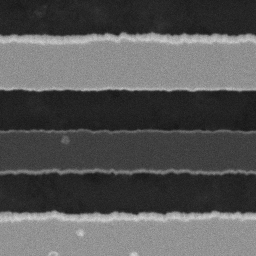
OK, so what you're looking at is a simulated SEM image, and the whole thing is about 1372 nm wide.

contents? lines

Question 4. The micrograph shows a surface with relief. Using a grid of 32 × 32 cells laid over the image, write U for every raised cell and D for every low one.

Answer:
DDDDDDDDDDDDDDDDDDDDDDDDDDDDDDDD
DDDDDDDDDDDDDDDDDDDDDDDDDDDDDDDD
DDDDDDDDDDDDDDDDDDDDDDDDDDDDDDDD
DDDDDDDDDDDDDDDDDDDDDDDDDDDDDDDD
DDDDDDDDDDDDDUDUDDDDDDDDDDDDDDDD
UUUUUUUUUUUUUUUUUUUUUUUUUUUUUUUU
UUUUUUUUUUUUUUUUUUUUUUUUUUUUUUUU
UUUUUUUUUUUUUUUUUUUUUUUUUUUUUUUU
UUUUUUUUUUUUUUUUUUUUUUUUUUUUUUUU
UUUUUUUUUUUUUUUUUUUUUUUUUUUUUUUU
UUUUUUUUUUUUUUUUUUUUUUUUUUUUUUUU
DDDDDDDDDDDDDDDDDDDDDDDDDDDDDDDD
DDDDDDDDDDDDDDDDDDDDDDDDDDDDDDDD
DDDDDDDDDDDDDDDDDDDDDDDDDDDDDDDD
DDDDDDDDDDDDDDDDDDDDDDDDDDDDDDDD
DDDDDDDDDDDDDDDDDDDDDDDDDDDDDDDD
UUUUUUUUUUUUUUUUUUUUUUUUUUUUUUUU
UUUUUUUUUUUUUUUUUUUUUUUUUUUUUUUU
UUUUUUUUUUUUUUUUUUUUUUUUUUUUUUUU
UUUUUUUUUUUUUUUUUUUUUUUUUUUUUUUU
UUUUUUUUUUUUUUUUUUUUUUUUUUUUUUUU
UUUUUUUUUUUUDUUUUUUUUDUUUUUUUUUU
DDDDDDDDDDDDDDDDDDDDDDDDDDDDDDDD
DDDDDDDDDDDDDDDDDDDDDDDDDDDDDDDD
DDDDDDDDDDDDDDDDDDDDDDDDDDDDDDDD
DDDDDDDDDDDDDDDDDDDDDDDDDDDDDDDD
DDDDDDDDDDDDDDDDDDDDDDDDDDDDDDDD
UUUUUUUUUUUUUUUUUUUUUUUUUUUUUUUU
UUUUUUUUUUUUUUUUUUUUUUUUUUUUUUUU
UUUUUUUUUUUUUUUUUUUUUUUUUUUUUUUU
UUUUUUUUUUUUUUUUUUUUUUUUUUUUUUUU
UUUUUUUUUUUUUUUUUUUUUUUUUUUUUUUU